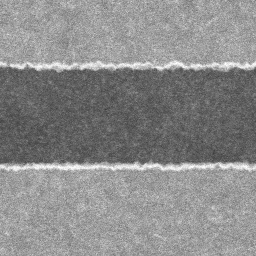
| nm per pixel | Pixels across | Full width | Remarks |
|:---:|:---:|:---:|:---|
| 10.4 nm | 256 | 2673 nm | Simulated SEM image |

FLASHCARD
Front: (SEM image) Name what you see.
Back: one or a few lines or trenches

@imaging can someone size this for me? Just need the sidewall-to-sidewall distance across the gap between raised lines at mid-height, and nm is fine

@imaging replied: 1050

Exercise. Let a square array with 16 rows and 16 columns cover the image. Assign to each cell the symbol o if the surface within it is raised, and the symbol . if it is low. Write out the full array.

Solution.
oooooooooooooooo
oooooooooooooooo
oooooooooooooooo
oooooooooooooooo
................
................
................
................
................
................
oooooooooo.ooooo
oooooooooooooooo
oooooooooooooooo
oooooooooooooooo
oooooooooooooooo
oooooooooooooooo